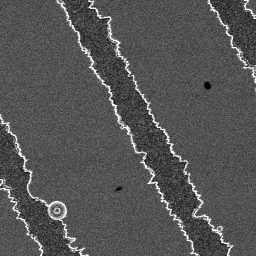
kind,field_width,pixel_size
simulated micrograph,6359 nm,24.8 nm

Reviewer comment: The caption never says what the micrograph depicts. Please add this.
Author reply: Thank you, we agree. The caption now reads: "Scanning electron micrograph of one or a few lines or trenches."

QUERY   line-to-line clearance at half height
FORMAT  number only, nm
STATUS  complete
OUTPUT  2580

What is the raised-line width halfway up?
693 nanometres